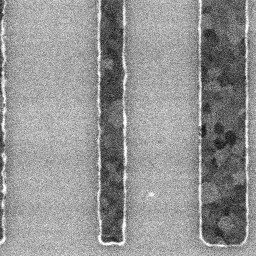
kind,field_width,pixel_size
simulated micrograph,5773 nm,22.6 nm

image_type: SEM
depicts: one or a few lines or trenches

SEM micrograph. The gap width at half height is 1910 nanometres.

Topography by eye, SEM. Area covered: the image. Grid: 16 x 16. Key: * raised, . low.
......**.....**.
......**....***.
......**....***.
......**....***.
......**....***.
......**.....**.
......**.....**.
......**.....**.
......**.....**.
......**.....**.
......**.....**.
......**.....**.
......**.....**.
......**.....**.
......**.....**.
................